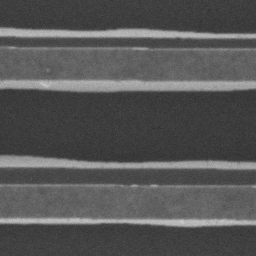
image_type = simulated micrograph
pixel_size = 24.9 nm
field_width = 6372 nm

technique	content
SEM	lines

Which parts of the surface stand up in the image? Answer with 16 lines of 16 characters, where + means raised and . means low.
................
................
++++++++++++++++
++++++++++++++++
++++++++++++++++
................
................
................
................
................
++++++++++++++++
++++++++++++++++
++++++++++++++++
++++++++++++++++
................
................